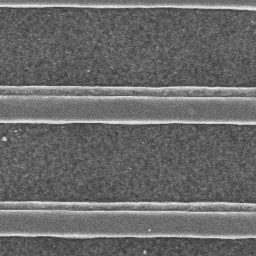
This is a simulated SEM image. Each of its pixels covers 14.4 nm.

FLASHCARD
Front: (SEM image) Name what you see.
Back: lines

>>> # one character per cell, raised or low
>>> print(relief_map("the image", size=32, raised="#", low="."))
################################
................................
................................
................................
................................
................................
................................
................................
................................
................................
................................
################################
################################
################################
################################
................................
................................
................................
................................
................................
................................
................................
................................
................................
................................
###########...######.#...####...
################################
################################
################################
.................#.....#########
................................
................................